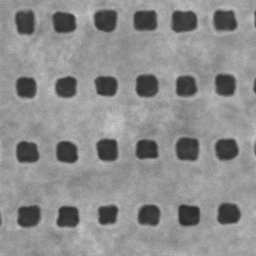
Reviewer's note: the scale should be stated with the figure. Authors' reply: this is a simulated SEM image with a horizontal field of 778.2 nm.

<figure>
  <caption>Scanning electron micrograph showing a regular array of holes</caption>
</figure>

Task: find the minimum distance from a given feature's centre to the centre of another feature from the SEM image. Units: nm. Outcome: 119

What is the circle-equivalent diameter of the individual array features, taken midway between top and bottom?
25.1 pixels